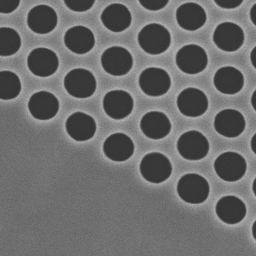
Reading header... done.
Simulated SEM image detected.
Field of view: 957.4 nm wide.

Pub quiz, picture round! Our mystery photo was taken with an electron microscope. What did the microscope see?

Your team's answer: a regular array of holes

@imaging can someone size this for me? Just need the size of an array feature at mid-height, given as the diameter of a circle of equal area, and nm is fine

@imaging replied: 111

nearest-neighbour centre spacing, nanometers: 160